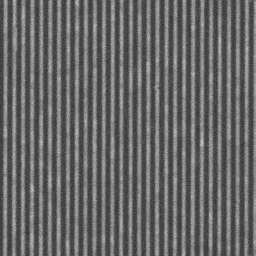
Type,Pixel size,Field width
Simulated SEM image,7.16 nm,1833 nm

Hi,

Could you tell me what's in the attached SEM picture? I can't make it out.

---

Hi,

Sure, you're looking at parallel lines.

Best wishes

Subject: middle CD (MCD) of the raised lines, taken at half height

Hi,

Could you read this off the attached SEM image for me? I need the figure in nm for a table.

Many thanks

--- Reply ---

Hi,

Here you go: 22.4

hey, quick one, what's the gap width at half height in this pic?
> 44.8 nm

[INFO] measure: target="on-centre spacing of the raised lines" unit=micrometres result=0.0639